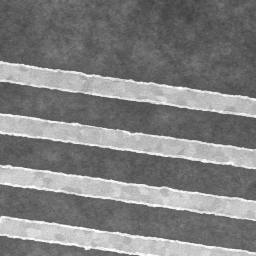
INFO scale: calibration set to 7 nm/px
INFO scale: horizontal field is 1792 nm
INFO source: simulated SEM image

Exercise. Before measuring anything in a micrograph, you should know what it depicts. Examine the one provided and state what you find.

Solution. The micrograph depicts parallel lines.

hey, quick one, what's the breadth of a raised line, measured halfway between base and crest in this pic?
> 0.132 microns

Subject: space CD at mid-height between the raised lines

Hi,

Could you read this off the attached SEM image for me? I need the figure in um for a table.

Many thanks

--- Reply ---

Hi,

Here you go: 0.223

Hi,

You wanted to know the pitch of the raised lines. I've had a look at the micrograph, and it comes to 0.356 micrometres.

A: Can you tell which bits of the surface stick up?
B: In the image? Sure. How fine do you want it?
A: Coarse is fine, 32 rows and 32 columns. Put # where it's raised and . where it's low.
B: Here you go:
................................
................................
................................
................................
................................
................................
................................
................................
#####...........................
############....................
..#################.............
.........#################......
................################
.......................#########
##.............................#
##########......................
################................
......#################.........
..............################..
....................############
.............................###
#######.........................
#############...................
....#################...........
..........#################.....
..................##############
........................########
###............................#
##########......................
.################...............
........#################.......
...............################.